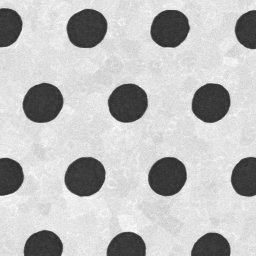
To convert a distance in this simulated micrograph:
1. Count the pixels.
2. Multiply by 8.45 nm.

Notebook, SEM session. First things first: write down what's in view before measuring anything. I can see holes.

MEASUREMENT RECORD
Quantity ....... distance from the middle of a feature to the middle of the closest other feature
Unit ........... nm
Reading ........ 701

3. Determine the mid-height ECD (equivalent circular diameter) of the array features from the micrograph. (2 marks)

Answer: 332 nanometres